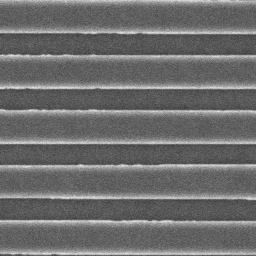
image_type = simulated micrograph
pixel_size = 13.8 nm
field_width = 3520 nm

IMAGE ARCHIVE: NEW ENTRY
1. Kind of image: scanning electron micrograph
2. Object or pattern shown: lines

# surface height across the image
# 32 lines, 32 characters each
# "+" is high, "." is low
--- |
++++++++++++++++++++++++++++++++
++++++++++++++++++++++++++++++++
++++++++++++++++++++++++++++++++
++++++++++++++++++++++++++++++++
................................
................................
................................
++++++++++++++++++++++++++++++++
++++++++++++++++++++++++++++++++
++++++++++++++++++++++++++++++++
++++++++++++++++++++++++++++++++
................................
................................
................................
++++++++++++++++++++++++++++++++
++++++++++++++++++++++++++++++++
++++++++++++++++++++++++++++++++
++++++++++++++++++++++++++++++++
................................
................................
................................
++++++++++++++++++++++++++++++++
++++++++++++++++++++++++++++++++
++++++++++++++++++++++++++++++++
++++++++++++++++++++++++++++++++
................................
................................
................................
++++++++++++++++++++++++++++++++
++++++++++++++++++++++++++++++++
++++++++++++++++++++++++++++++++
++++++++++++++++++++++++++++++++